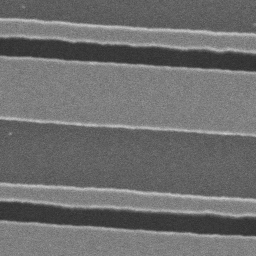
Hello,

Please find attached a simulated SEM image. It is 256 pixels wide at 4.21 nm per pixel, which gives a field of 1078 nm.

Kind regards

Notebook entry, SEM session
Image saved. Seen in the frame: lines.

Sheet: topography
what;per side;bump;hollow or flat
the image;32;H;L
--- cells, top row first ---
LLLLLLLLLLLLLLLLLLLLLLLLLLLLLLLL
LLLLLLLLLLLLLLLLLLLLLLLLLLLLLLLL
HHHHLLLLLLLLLLLLLLLLLLLLLLLLLLLL
HHHHHHHHHHHHHHHHLLLLLLLLLLLLLLLL
HHHHHHHHHHHHHHHHHHHHHHHHHHHHHHHH
LLLLLLLLLLLLLLLHHHHHHHHHHHHHHHHH
LLLLLLLLLLLLLLLLLLLLLLLLLLLLLLLH
HHHHHHHLLLLLLLLLLLLLLLLLLLLLLLLL
HHHHHHHHHHHHHHHHHHHHHHHHLLLLLLLL
HHHHHHHHHHHHHHHHHHHHHHHHHHHHHHHH
HHHHHHHHHHHHHHHHHHHHHHHHHHHHHHHH
HHHHHHHHHHHHHHHHHHHHHHHHHHHHHHHH
HHHHHHHHHHHHHHHHHHHHHHHHHHHHHHHH
HHHHHHHHHHHHHHHHHHHHHHHHHHHHHHHH
HHHHHHHHHHHHHHHHHHHHHHHHHHHHHHHH
LLLLLLLLHHHHHHHHHHHHHHHHHHHHHHHH
LLLLLLLLLLLLLLLLLLLLLLLLLHHHHHHH
LLLLLLLLLLLLLLLLLLLLLLLLLLLLLLLL
LLLLLLLLLLLLLLLLLLLLLLLLLLLLLLLL
LLLLLLLLLLLLLLLLLLLLLLLLLLLLLLLL
LLLLLLLLLLLLLLLLLLLLLLLLLLLLLLLL
LLLLLLLLLLLLLLLLLLLLLLLLLLLLLLLL
LLLLLLLLLLLLLLLLLLLLLLLLLLLLLLLL
HHHHHHHHHHLLLLLLLLLLLLLLLLLLLLLL
HHHHHHHHHHHHHHHHHHHHHHHLLLLLLLLL
LLLLLLHHHHHHHHHHHHHHHHHHHHHHHHHH
LLLLLLLLLLLLLLLLLLLLLLHHHHHHHHHH
LLLLLLLLLLLLLLLLLLLLLLLLLLLLLLLL
HHHHHHHHHHHHHLLLLLLLLLLLLLLLLLLL
HHHHHHHHHHHHHHHHHHHHHHHHHHHHHHHL
HHHHHHHHHHHHHHHHHHHHHHHHHHHHHHHH
HHHHHHHHHHHHHHHHHHHHHHHHHHHHHHHH